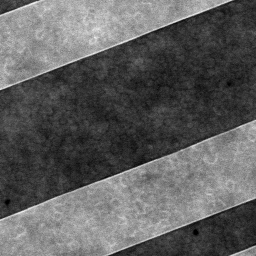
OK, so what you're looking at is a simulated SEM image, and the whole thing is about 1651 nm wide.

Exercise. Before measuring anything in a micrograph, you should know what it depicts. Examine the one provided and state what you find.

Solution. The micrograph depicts one or a few lines or trenches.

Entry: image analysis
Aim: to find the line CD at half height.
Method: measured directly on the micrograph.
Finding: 462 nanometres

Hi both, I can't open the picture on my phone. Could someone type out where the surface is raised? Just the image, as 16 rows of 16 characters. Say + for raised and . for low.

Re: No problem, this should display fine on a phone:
.++++++++++++...
+++++++++++.....
++++++++........
++++++..........
+++.............
................
................
................
..............++
...........+++++
........++++++++
......++++++++++
...+++++++++++++
.++++++++++++...
+++++++++++.....
++++++++........